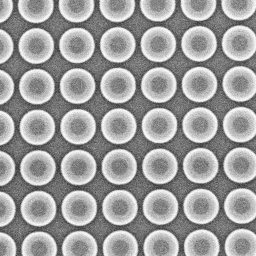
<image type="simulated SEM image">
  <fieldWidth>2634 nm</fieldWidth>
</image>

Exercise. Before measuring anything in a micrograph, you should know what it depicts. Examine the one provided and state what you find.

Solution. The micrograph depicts an array of small figures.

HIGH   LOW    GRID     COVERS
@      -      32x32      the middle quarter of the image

--------------------------------
--@@@-------@@@-------@@@@------
@@@@@@@---@@@@@@@---@@@@@@@---@@
@@@@@@@---@@@@@@@---@@@@@@@@--@@
@@@@@@@@-@@@@@@@@@-@@@@@@@@@--@@
@@@@@@@@-@@@@@@@@@-@@@@@@@@@--@@
@@@@@@@@-@@@@@@@@@-@@@@@@@@@--@@
@@@@@@@---@@@@@@@---@@@@@@@---@@
@@@@@@----@@@@@@@----@@@@@@----@
--@@@-------@@@-----------------
--------------------------------
------------@@@-------@@@@------
-@@@@@-----@@@@@@----@@@@@@----@
@@@@@@@---@@@@@@@---@@@@@@@@--@@
@@@@@@@@--@@@@@@@@--@@@@@@@@--@@
@@@@@@@@--@@@@@@@@--@@@@@@@@--@@
@@@@@@@@--@@@@@@@@--@@@@@@@@--@@
@@@@@@@---@@@@@@@@--@@@@@@@@--@@
@@@@@@@----@@@@@@----@@@@@@----@
-@@@@@------@@@--------@@-------
--------------------------------
-------------@@-------@@@-------
-@@@@@-----@@@@@@----@@@@@@----@
@@@@@@@---@@@@@@@---@@@@@@@@--@@
@@@@@@@@--@@@@@@@@--@@@@@@@@--@@
@@@@@@@@--@@@@@@@@--@@@@@@@@--@@
@@@@@@@@--@@@@@@@@--@@@@@@@@--@@
@@@@@@@@--@@@@@@@@--@@@@@@@@--@@
@@@@@@@----@@@@@@----@@@@@@----@
-@@@@@------@@@@------@@@@------
--------------------------------
--------------------------------